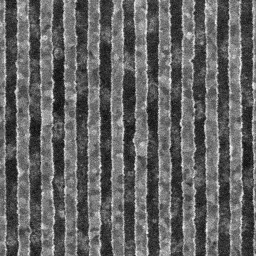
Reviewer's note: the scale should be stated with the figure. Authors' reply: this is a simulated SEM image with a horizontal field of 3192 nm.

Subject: parallel lines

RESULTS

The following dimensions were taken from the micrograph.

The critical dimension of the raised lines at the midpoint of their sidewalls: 139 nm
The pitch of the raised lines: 294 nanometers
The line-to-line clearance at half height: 154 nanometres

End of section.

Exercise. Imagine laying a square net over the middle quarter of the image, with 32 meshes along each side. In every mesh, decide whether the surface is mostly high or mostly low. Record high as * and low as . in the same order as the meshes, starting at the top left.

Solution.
***...***...***...***...***...**
***...***...***...***...***...**
***...***...***...***...**....**
***...***...***...***...**....**
***...***...***...***...***...**
***...***...***...***...**....**
***...***...***...***...**....**
***...***...***...***...**....**
***...***...***...***...**....**
***...***...**....**....**....**
***...***...***...***...**....**
***...***...***...**....***...**
***...***...***...***...**....**
***...***...***...***...***..***
***...***...***...***...***..***
***...***...***...***...***..***
***...***...***...***...**.*.***
***...***...***...***...***..***
***...***...***..****...***..***
***...***...***..****...***..***
***...***...***...***...***..***
***...***...***...***...**....**
***...***...***...***...**...***
***...***...***...***...***...**
***...***...***...***...***...**
***...***...***...**....***..***
***...***...***...***...***...**
***...***...***...***...***...**
***...***...***...***...***...**
***...***...***...***...***...**
***...***...***...***...***...**
***...***...***...***...***...**